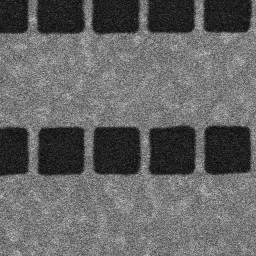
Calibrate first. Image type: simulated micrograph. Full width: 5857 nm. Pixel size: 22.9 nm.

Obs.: holes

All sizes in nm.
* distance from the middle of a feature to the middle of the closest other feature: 1260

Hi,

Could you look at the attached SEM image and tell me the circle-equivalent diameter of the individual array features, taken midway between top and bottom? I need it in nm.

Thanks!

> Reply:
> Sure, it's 1210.